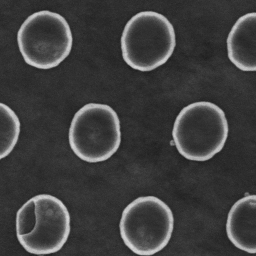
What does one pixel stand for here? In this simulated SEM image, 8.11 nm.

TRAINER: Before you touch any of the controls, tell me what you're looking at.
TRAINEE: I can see raised bodies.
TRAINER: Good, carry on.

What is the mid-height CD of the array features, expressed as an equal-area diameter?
52.7 pixels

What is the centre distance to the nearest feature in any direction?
840 nm